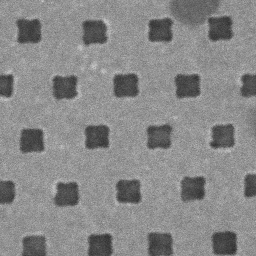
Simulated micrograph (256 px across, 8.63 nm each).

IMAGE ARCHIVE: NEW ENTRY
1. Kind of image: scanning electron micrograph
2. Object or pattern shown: a regular array of holes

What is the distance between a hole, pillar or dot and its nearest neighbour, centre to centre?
59.8 px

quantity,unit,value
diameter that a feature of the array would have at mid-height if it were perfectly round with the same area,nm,237